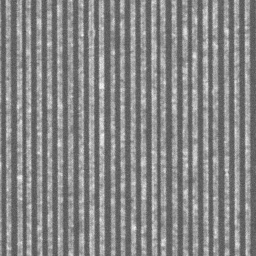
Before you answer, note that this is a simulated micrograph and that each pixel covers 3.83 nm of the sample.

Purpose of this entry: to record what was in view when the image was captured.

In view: parallel lines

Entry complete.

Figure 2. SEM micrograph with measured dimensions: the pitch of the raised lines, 39.8 nm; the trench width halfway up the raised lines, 6.27 pixels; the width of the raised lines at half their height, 16.8 nm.